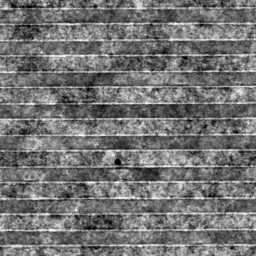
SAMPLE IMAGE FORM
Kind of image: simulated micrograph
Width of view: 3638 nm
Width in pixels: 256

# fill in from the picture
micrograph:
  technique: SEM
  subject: parallel lines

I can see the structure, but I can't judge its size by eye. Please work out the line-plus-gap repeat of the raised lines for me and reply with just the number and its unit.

0.45 um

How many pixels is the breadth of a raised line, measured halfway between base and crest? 17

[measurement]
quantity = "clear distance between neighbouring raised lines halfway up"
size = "0.206 um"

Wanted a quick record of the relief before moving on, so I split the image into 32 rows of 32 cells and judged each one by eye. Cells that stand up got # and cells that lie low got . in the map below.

################################
................................
................................
################################
################################
................................
................................
################################
################################
................................
......................#.........
################################
################################
................................
................................
################################
################################
................................
................................
################################
################################
...............#................
...#............................
################################
################################
................................
................................
################################
################################
................................
................................
################################